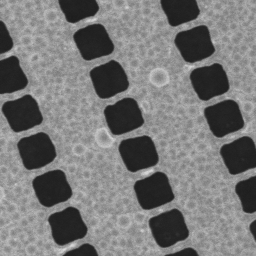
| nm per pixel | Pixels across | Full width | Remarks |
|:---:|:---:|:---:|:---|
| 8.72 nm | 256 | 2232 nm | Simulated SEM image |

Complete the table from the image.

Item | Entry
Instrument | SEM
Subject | a regular array of holes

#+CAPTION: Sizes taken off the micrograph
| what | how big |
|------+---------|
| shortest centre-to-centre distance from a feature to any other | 347 nm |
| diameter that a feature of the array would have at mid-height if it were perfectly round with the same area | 324 nm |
